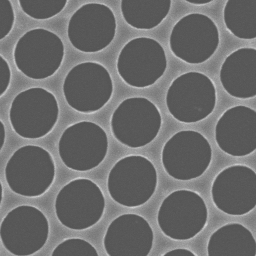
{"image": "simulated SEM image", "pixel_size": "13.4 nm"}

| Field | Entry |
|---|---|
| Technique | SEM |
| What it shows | a regular array of holes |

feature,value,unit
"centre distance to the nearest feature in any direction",58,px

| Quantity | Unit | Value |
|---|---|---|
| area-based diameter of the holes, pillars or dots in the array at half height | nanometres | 664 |